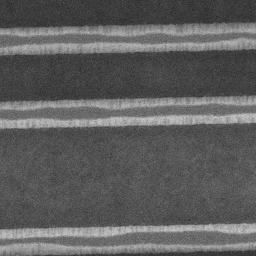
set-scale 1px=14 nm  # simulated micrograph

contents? lines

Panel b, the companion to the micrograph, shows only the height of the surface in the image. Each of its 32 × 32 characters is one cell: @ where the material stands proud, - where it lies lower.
--------------------------------
--------------------------------
--------------------------------
------------------@@@@@@@@@@@@@@
@@@@@@@@@@@@@@@@@@@@@@@@@@@@@@@@
@@@@@@@@@@@@@@@@@@@@@@@@@@@@@@@@
@@------------------------------
--------------------------------
--------------------------------
--------------------------------
--------------------------------
--------------------------------
------------------------@@@@@@@@
@@@@@@@@@@@@@@@@@@@@@@@@@@@@@@@@
@@@@@@@@@@@@@@@@@@@@@@@@@@@@@@@@
@@@@@@@@@@@@@-------------------
--------------------------------
--------------------------------
--------------------------------
--------------------------------
--------------------------------
--------------------------------
--------------------------------
--------------------------------
--------------------------------
--------------------------------
--------------------------------
--------------------------------
----------------------@@@@@@@@@@
@@@@@@@@@@@@@@@@@@@@@@@@@@@@@@@@
@@@@@@@@@@@@@@@@@@@@@@@@@@@@@@@@
@-------------------------------